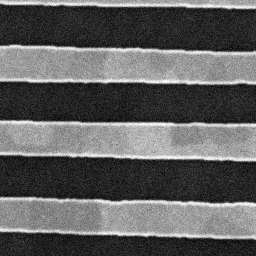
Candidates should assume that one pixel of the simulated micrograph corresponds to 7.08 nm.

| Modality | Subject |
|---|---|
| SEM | lines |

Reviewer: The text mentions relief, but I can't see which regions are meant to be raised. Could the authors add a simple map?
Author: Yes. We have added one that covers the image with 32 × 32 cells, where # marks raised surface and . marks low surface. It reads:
.....###########################
................................
................................
................................
................................
................................
###########################.....
################################
################################
################################
................................
................................
................................
................................
................................
######################.###......
################################
################################
################################
........########################
................................
................................
................................
................................
................................
##########################..####
################################
################################
################################
......................##########
................................
................................